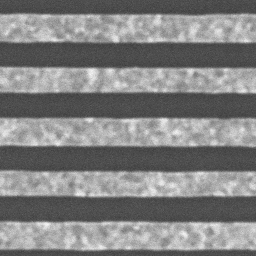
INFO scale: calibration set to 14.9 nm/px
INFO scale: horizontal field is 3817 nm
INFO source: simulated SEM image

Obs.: wiring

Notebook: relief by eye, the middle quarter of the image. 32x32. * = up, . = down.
................................
********************************
********************************
********************************
********************************
********************************
********************************
................................
................................
................................
................................
................................
................................
................................
********************************
********************************
********************************
********************************
********************************
********************************
................................
................................
................................
................................
................................
................................
................................
********************************
********************************
********************************
********************************
********************************